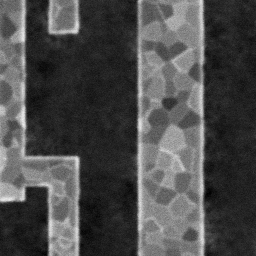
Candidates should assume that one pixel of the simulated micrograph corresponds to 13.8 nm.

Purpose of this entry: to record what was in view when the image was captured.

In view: wiring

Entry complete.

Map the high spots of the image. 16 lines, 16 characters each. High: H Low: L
HHLHHLLLLHHHHLLL
HLLHHLLLLHHHHLLL
HLLLLLLLLHHHHLLL
HLLLLLLLLHHHHLLL
HHLLLLLLLHHHHLLL
HHLLLLLLLHHHHLLL
HHLLLLLLLHHHHLLL
HHLLLLLLLHHHHLLL
HHLLLLLLLHHHHLLL
HHLLLLLLLHHHHLLL
HHHHHLLLLHHHHLLL
HHHHHLLLLHHHHLLL
HLLHHLLLLHHHHLLL
LLLHHLLLLHHHHLLL
LLLHHLLLLHHHHLLL
LLLHHLLLLHHHHLLL